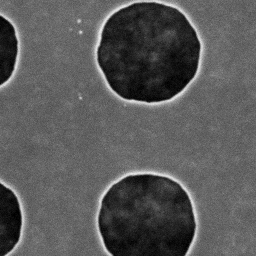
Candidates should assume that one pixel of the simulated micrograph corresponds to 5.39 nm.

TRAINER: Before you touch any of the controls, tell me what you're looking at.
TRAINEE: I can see holes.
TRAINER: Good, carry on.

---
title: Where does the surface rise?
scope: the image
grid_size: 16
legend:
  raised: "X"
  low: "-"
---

XXXXXXXX---XXXXX
-XXXXXX-----XXXX
-XXXXX------XXXX
-XXXXX------XXXX
-XXXXX------XXXX
XXXXXXX-----XXXX
XXXXXXXXXXXXXXXX
XXXXXXXXXXXXXXXX
XXXXXXXXXXXXXXXX
XXXXXXXXXXXXXXXX
XXXXXXXXXXXXXXXX
XXXXXXX----XXXXX
-XXXXX------XXXX
-XXXXX------XXXX
-XXXXX------XXXX
-XXXXXX-----XXXX